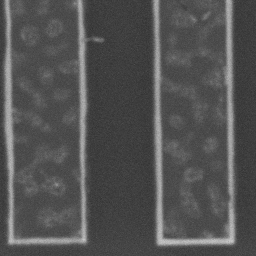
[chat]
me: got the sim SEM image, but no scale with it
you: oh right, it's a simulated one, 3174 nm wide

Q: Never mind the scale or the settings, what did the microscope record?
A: one or a few lines or trenches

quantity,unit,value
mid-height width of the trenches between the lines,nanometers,936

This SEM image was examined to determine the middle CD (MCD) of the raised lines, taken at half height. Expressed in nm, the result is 902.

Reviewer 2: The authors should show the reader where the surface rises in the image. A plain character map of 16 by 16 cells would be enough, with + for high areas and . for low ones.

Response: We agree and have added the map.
+++++.....++++..
+++++.....++++..
.++++.....++++..
.++++.....++++..
+++++.....++++..
+++++.....++++..
.++++.....++++..
.++++.....++++..
.++++.....++++..
.++++.....++++..
.++++.....++++..
.++++.....++++..
.++++.....++++..
.++++.....++++..
.++++.....++++..
................